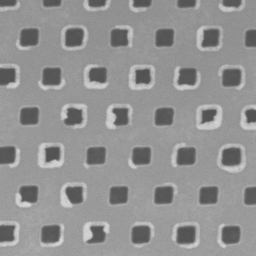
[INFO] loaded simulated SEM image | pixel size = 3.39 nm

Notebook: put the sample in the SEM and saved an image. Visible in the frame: a regular array of holes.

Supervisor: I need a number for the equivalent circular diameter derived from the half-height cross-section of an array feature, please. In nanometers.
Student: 67.4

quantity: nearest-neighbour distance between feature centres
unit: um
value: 0.15